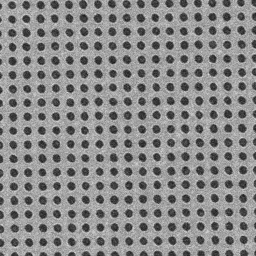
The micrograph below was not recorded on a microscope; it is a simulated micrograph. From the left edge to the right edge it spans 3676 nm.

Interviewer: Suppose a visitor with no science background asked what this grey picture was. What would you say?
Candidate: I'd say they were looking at a regular array of holes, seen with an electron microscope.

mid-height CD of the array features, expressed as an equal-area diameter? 134 nm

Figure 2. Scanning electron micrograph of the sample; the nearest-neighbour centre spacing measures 13.8 pixels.